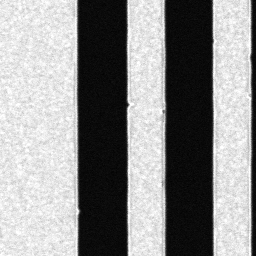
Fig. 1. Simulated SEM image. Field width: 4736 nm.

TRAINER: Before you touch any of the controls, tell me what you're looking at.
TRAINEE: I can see one or a few lines or trenches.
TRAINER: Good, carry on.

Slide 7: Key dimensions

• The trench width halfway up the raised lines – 643 nanometres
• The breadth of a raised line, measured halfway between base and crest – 950 nm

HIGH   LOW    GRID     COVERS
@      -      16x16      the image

-----@@@--@@@---
-----@@@--@@@---
-----@@@--@@@---
-----@@@--@@@---
-----@@@--@@@---
-----@@@--@@@---
-----@@@--@@@---
-----@@@--@@@---
-----@@@--@@@---
-----@@@--@@@---
-----@@@--@@@---
-----@@@--@@@---
-----@@@--@@@---
-----@@@--@@@---
-----@@@--@@@---
-----@@@--@@@---